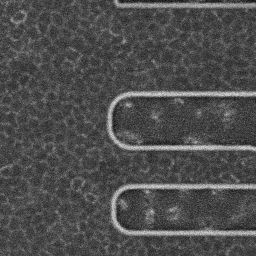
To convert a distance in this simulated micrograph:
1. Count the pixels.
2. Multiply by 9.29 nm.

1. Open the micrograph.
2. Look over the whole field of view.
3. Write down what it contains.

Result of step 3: one or a few lines or trenches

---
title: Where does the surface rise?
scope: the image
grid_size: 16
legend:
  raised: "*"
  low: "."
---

****************
****************
****************
****************
****************
****************
*******.........
*******.........
*******.........
****************
****************
****************
*******.........
*******.........
********........
****************